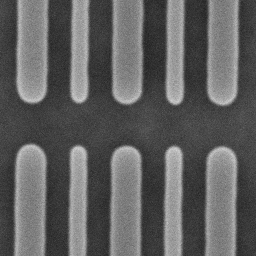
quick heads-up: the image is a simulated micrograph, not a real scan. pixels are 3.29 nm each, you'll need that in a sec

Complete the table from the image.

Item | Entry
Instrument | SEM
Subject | groups of lines, slits or small figures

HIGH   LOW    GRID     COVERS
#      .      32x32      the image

..####...##...####...##...####..
..####...##...####...##...####..
..####...##...####...##...####..
..####...##...####...##...####..
..####...##...####...##...####..
..####...##...####...##...####..
..####...##...####...##...####..
..####...##...####...##...####..
..####...##...####...##...####..
..####...##...####...##...####..
..####...##...####...##...####..
..####...##...####...##...####..
...##....#.....##....##....##...
................................
................................
................................
................................
................................
...##....#.....#................
..####...##...###....##...###...
..####...##...###....##...###...
..####...##...####...##...###...
..####...##...###....##...###...
..####...##...###....##...###...
..####...##...###....##...###...
..####...##...###....##...###...
..####...##...###....##...###...
..####...##...###....##...###...
..####...##...###....##...###...
..####...##...###....##...###...
..####...##...###....##...###...
..###....##...###....##...###...